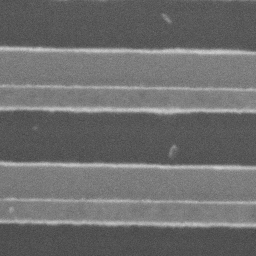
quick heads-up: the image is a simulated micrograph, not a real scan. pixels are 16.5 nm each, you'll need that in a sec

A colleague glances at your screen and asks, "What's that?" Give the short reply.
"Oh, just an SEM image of lines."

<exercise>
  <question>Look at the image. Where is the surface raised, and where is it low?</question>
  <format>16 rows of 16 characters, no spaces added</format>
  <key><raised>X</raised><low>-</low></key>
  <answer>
----------------
----------------
----------------
XXXXXXXXXXXXXXXX
XXXXXXXXXXXXXXXX
XXXXXXXXXXXXXXXX
XXXXXXXXXXXXXXXX
----------------
----------------
----------------
XXXXXXXXXXX-----
XXXXXXXXXXXXXXXX
XXXXXXXXXXXXXXXX
XXXXXXXXXXXXXXXX
----------------
----------------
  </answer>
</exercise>